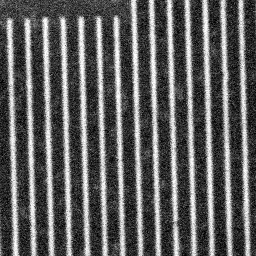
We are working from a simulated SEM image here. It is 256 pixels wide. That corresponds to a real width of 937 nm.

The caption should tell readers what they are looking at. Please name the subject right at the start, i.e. parallel lines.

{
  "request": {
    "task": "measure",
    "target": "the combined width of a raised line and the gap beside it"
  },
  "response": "65.3 nanometers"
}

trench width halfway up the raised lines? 52.6 nanometres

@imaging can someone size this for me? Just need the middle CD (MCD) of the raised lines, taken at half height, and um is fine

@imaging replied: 0.0142